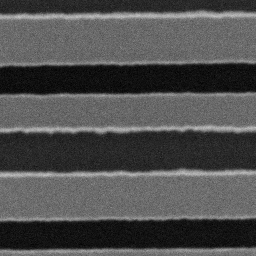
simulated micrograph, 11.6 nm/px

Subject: lines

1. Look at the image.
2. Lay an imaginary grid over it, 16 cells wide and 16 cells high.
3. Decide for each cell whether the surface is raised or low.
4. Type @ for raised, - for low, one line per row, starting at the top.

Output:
----------------
@@@@@@@@@@@@@@@@
@@@@@@@@@@@@@@@@
@@@@@@@@@@@@@@@@
----------------
----------------
@@@@@@@@@@@@@@@@
@@@@@@@@@@@@@@@@
----------------
----------------
----------------
@@@@@@@@@@@@@@@@
@@@@@@@@@@@@@@@@
@@@@@@@@@@@@@@@@
----------------
----------------